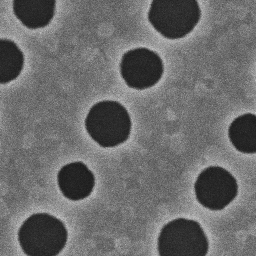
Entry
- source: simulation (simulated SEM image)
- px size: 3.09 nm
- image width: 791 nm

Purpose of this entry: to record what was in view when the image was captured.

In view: holes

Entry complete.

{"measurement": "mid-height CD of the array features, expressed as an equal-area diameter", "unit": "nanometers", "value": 132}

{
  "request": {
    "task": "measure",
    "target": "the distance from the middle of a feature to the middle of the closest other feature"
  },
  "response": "202 nm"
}